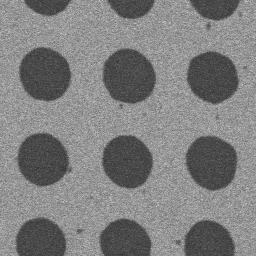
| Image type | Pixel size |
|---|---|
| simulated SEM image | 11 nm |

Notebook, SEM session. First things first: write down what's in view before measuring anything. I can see holes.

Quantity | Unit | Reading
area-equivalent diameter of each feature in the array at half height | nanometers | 573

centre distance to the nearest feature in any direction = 927 nm